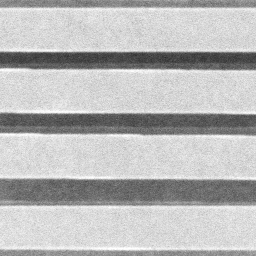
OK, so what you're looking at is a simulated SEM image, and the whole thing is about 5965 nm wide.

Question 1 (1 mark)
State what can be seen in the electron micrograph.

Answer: lines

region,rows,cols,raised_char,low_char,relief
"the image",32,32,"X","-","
--------------------------------
XXXXXXXXXXXXXXXXXXXXXXXXXXXXXXXX
XXXXXXXXXXXXXXXXXXXXXXXXXXXXXXXX
XXXXXXXXXXXXXXXXXXXXXXXXXXXXXXXX
XXXXXXXXXXXXXXXXXXXXXXXXXXXXXXXX
XXXXXXXXXXXXXXXXXXXXXXXXXXXXXXXX
--------------------------------
--------------------------------
--------------------------------
XXXXXXXXXXXXXXXXXXXXXXXXXXXXXXXX
XXXXXXXXXXXXXXXXXXXXXXXXXXXXXXXX
XXXXXXXXXXXXXXXXXXXXXXXXXXXXXXXX
XXXXXXXXXXXXXXXXXXXXXXXXXXXXXXXX
XXXXXXXXXXXXXXXXXXXXXXXXXXXXXXXX
--------------------------------
--------------------------------
--------------------------------
XXXXXXXXXXXXXXXXXXXXXXXXXXXXXXXX
XXXXXXXXXXXXXXXXXXXXXXXXXXXXXXXX
XXXXXXXXXXXXXXXXXXXXXXXXXXXXXXXX
XXXXXXXXXXXXXXXXXXXXXXXXXXXXXXXX
XXXXXXXXXXXXXXXXXXXXXXXXXXXXXXXX
--------------------------------
--------------------------------
--------------------------------
--------------------------------
XXXXXXXXXXXXXXXXXXXXXXXXXXXXXXXX
XXXXXXXXXXXXXXXXXXXXXXXXXXXXXXXX
XXXXXXXXXXXXXXXXXXXXXXXXXXXXXXXX
XXXXXXXXXXXXXXXXXXXXXXXXXXXXXXXX
XXXXXXXXXXXXXXXXXXXXXXXXXXXXXXXX
--------------------------------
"